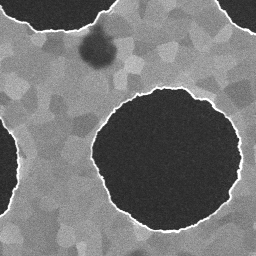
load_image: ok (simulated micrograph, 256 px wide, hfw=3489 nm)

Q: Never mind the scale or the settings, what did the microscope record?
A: holes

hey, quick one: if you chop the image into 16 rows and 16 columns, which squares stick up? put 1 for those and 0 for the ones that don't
0000000111111100
1100001111111110
1111111111111111
1111111111111111
1111111111111111
1111111111111111
1111111100000111
1111111000000011
0111110000000001
0111110000000001
0111110000000001
0111111000000001
0111111000000011
1111111100000111
1111111111111111
1111111111111111